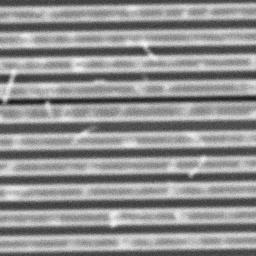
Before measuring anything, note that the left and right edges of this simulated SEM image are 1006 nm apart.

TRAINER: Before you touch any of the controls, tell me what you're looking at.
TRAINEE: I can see parallel lines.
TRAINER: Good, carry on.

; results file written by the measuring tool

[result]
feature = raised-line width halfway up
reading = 55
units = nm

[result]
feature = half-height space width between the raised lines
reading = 0.0442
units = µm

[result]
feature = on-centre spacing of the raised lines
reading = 100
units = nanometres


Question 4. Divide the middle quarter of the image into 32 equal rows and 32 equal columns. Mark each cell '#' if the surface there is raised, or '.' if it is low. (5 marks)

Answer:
################################
########################........
................................
................................
.........#................######
################################
################################
################################
................................
................................
################################
################################
################################
################################
................................
................................
................................
....##.......###################
################################
################################
#############################...
................................
................................
...............................#
################################
################################
################################
................................
................................
................................
################################
################################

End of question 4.